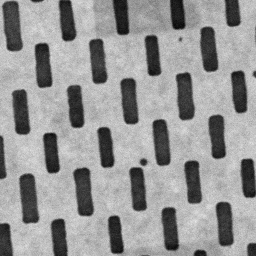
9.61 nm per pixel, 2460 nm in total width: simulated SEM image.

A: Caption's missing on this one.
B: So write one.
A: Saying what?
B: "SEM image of a regular array of holes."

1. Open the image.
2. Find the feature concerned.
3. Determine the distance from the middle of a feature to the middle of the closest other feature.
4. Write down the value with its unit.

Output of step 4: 50.6 pixels